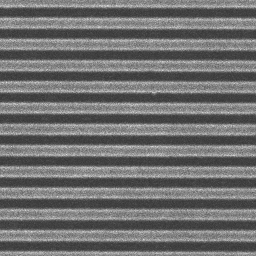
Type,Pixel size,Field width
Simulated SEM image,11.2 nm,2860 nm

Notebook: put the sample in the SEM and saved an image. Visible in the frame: parallel lines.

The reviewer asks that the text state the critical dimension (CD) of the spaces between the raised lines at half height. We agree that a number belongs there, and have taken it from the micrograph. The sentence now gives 102 nm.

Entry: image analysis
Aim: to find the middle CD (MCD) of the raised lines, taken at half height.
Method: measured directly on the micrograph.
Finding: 133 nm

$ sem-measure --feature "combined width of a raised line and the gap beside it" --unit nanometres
237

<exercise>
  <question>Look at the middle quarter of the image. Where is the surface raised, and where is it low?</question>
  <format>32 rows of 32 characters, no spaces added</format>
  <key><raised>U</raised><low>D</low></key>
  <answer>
UUUUUUUUUUUUUUUUUUUUUUUUUUUUUUUU
UUUUUUUUUUUUUUUUUUUUUUUUUUUUUUUU
DDDDDDDDDDDDDDDDDDDDDDDDDDDDDDDD
DDDDDDDDDDDDDDDDDDDDDDDDDDDDDDDD
UUUUUUUUUUUUUUUUUUUUUUUUUUUUUUUU
UUUUUUUUUUUUUUUUUUUUUUUUUUUUUUUU
UUUUUUUUUUUUUUUUUUUUUUUUUUUUUUUU
DDDDDDDDDDDDDDDDDDDDDDDDDDDDDDDD
DDDDDDDDDDDDDDDDDDDDDDDDDDDDDDDD
DDDDDDDDDDDDDDDDDDDDDDDDDDDDDDDD
UUUUUUUUUUUUUUUUUUUUUUUUUUUUUUUU
UUUUUUUUUUUUUUUUUUUUUUUUUUUUUUUU
DDDDDDDDDDDDDDDDDDDDDDDDDDDDUUUU
DDDDDDDDDDDDDDDDDDDDDDDDDDDDDDDD
DDDDDDDDDDDDDDDDDDDDDDDDDDDDDDDD
UUUUUUUUUUUUUUUUUUUUUUUUUUUUUUUU
UUUUUUUUUUUUUUUUUUUUUUUUUUUUUUUU
UUUUUUUUUUUUUUUUUUUUUUUUUUUUUUUU
DDDDDDDDDDDDDDDDDDDDDDDDDDDDDDDD
DDDDDDDDDDDDDDDDDDDDDDDDDDDDDDDD
UUUUUUUUUUUUUUUUUUUUUUUUUUUUUUUU
UUUUUUUUUUUUUUUUUUUUUUUUUUUUUUUU
UUUUUUUUUUUUUUUUUUUUUUUUUUUUUUUU
DDDDDDDDDDDDDDDDDDDDDDDDDDDDDDDD
DDDDDDDDDDDDDDDDDDDDDDDDDDDDDDDD
UUUUUUDDDDDDDDDDDDDDDDDDDDDDDDDD
UUUUUUUUUUUUUUUUUUUUUUUUUUUUUUUU
UUUUUUUUUUUUUUUUUUUUUUUUUUUUUUUU
DDDDDDDDDDDDDDDDDDDDDDDDDDDDUUUU
DDDDDDDDDDDDDDDDDDDDDDDDDDDDDDDD
DDDDDDDDDDDDDDDDDDDDDDDDDDDDDDDD
UUUUUUUUUUUUUUUUUUUUUUUUUUUUUUUU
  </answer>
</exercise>